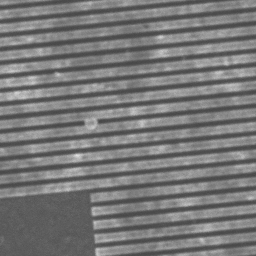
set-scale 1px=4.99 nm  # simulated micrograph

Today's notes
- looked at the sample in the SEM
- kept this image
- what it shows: parallel lines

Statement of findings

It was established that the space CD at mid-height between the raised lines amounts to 27.9 nanometres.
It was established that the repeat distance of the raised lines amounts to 68.3 nm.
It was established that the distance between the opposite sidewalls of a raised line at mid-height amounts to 41.6 nanometers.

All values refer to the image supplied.